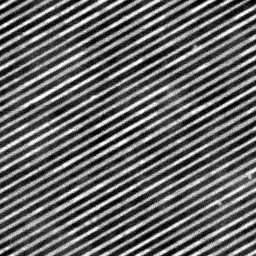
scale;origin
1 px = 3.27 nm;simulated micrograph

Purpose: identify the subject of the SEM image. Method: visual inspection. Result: parallel lines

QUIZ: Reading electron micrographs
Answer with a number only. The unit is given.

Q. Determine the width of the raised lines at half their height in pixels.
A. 2.26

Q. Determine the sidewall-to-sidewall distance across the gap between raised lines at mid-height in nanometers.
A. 21.7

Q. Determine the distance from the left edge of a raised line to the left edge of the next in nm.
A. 29.1